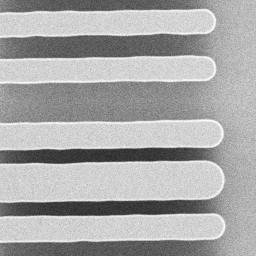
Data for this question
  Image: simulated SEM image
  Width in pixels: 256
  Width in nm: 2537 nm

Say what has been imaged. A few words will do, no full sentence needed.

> groups of lines, slits or small figures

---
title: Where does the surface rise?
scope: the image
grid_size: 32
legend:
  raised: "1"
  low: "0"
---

00000000000000000000000000000000
00000001110000111111111111000000
11111111111111111111111111100000
11111111111111111111111111100000
11110000000000000000000000000000
00000000000000000000000000000000
00000000000000000000000000000000
11111111111111111111111111000000
11111111111111111111111111100000
11111111111111111111111111100000
00000000000000000000000000000000
00000000000000000000000000000000
00000000000000000000000000000000
00000000000000000000000000000000
00000000000000000000000000000000
11111111111111111111111111100000
11111111111111111111111111110000
11111111111111111111111111110000
11111111111111100000000000000000
00000000000000000000000000000000
00011100011111111111111111100000
11111111111111111111111111110000
11111111111111111111111111110000
11111111111111111111111111110000
11111111111111111111111111100000
00000000000000000000000000000000
00000000000000000000000000000000
11111111111111111111111111110000
11111111111111111111111111110000
11111111111111111111111111100000
00000000000000000000000000000000
00000000000000000000000000000000